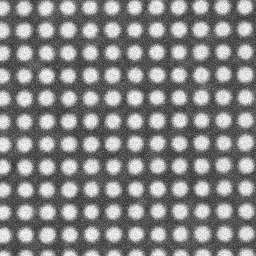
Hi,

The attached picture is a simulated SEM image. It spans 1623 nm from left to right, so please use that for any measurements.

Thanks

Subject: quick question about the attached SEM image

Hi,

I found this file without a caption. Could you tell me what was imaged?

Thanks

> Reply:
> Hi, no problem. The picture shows a regular array of raised bodies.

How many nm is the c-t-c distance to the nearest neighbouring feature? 139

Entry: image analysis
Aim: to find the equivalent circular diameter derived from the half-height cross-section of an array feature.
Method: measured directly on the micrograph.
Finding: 80.9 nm